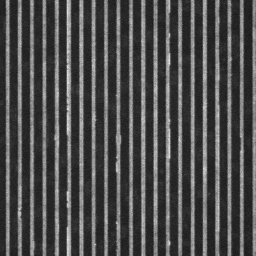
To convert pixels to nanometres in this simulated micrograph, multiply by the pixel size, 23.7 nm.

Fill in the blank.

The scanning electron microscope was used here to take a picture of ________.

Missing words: parallel lines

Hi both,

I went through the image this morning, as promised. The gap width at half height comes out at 0.222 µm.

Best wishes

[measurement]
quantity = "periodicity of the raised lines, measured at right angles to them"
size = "291 nm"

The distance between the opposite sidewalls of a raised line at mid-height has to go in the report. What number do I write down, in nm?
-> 73.9